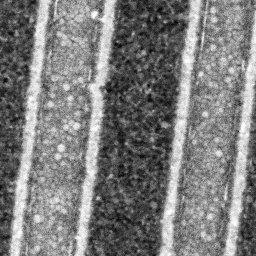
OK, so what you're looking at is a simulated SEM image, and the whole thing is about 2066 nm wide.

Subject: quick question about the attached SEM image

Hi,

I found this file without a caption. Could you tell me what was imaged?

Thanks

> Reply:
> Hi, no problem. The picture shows one or a few lines or trenches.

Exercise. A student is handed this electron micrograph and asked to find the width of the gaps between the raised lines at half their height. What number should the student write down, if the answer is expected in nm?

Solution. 519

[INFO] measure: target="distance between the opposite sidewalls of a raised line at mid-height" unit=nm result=688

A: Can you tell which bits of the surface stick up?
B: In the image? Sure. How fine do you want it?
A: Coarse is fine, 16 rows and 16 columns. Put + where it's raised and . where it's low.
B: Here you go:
+++....+++++....
+++....+++++....
+++....+++++....
++....++++++....
++....++++++....
++....++++++....
++....+++++....+
++....+++++....+
++....+++++....+
++....+++++....+
++....+++++....+
+.....+++++....+
+....++++++....+
+....++++++....+
+....++++++....+
+....+++++....++